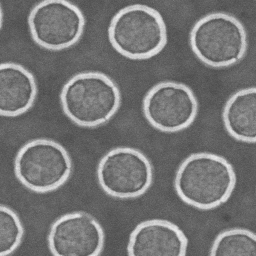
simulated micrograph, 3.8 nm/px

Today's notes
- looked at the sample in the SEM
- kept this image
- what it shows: raised bodies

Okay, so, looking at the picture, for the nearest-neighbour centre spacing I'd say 306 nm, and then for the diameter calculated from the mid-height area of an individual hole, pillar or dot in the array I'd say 208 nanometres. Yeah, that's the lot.